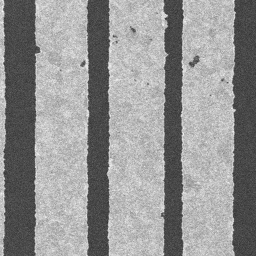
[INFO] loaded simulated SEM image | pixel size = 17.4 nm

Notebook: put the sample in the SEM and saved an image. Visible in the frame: one or a few lines or trenches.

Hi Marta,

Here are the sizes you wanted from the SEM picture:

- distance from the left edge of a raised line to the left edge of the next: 1.27 um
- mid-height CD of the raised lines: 885 nm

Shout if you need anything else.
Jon